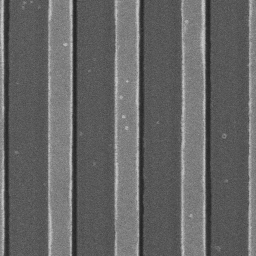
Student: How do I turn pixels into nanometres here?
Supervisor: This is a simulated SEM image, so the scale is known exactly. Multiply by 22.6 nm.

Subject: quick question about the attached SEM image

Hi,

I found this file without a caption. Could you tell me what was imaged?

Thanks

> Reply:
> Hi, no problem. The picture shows lines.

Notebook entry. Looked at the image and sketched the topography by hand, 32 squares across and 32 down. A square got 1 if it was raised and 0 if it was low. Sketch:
00000011100000111000000110000001
00000011100000111000000111000001
00000011100000111000000111000001
00000011100000011000000111000001
00000011100000011000000111000001
00000011100000011000000111000001
00000011100000011000000111000001
00000011100000111000000111000001
00000011100000111000000111000001
00000011100000111000000111000001
00000011100000111000000111000001
00000011100000111000000111000001
00000011100000111000000111000001
00000011100000111000000111000001
00000011100000111000000111000001
00000011100000111000000111000001
00000011100000111000000111000001
00000011100000111000000111000001
00000011100000111000000111000001
00000011100000111000000111000001
00000011100000111000000111000001
00000011100000111000000111000001
00000011100000111000000111000001
00000011100000111000000111000001
00000011100000111000000111000001
00000011100000111000000111000001
00000011100000111000000111000001
10000011100000111000000111000001
00000011100000111000000111000001
10000011100000111000000111000001
00000011100000111000000111000001
00000011100000111000000111000001